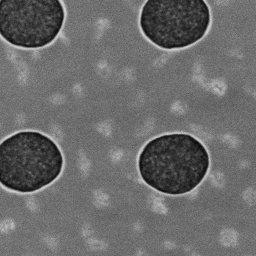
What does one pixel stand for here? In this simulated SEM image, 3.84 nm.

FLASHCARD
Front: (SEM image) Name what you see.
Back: holes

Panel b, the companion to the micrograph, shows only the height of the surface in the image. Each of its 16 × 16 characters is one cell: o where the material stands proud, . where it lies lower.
....ooooo....ooo
....ooooo....ooo
...oooooo...oooo
oooooooooooooooo
oooooooooooooooo
oooooooooooooooo
oooooooooooooooo
oooooooooooooooo
o..ooooooo..oooo
....ooooo....ooo
....ooooo....ooo
...oooooo...oooo
oooooooooooooooo
oooooooooooooooo
oooooooooooooooo
oooooooooooooooo